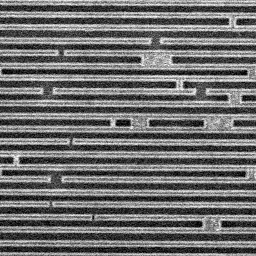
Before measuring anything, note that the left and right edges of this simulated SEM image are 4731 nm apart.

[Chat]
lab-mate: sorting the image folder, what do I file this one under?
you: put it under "parallel lines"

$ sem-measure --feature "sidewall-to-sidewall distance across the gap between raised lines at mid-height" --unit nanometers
143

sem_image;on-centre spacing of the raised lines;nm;235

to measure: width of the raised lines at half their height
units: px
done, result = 5.12